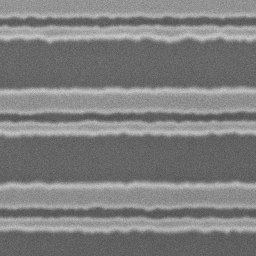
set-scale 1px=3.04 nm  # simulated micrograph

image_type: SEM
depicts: lines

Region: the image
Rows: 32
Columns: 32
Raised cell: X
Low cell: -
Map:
XXXXXXXXXXXXXXXXXXXXXXXXXXXXXXXX
XXXXXXXXXXXXXXXXXXXXXXXXXXXXXXXX
XXXXXXXXXXXXXXXXXXXXXXXXXXXXXXXX
XXXXXXXXXXXXXXXXXXXXXXXXXXXXXXXX
XXXXXXXXXXXXXXXXXXXXXXXXXXX-XXXX
--------------------------------
--------------------------------
--------------------------------
--------------------------------
--------------------------------
--------------------------------
XXXXXXXXXXXXXXXXXXXXXXXXXXXXXXXX
XXXXXXXXXXXXXXXXXXXXXXXXXXXXXXXX
XXXXXXXXXXXXXXXXXXXXXXXXXXXXXXXX
XXXXXXXXXXXXXXXXXXXXXXXXXXXXXXXX
XXXXXXXXXXXXXXXXXXXXXXXXXXXXXXXX
XXXXXXXXXXXXXXX-XXXXXXXXXX-X--XX
--------------------------------
--------------------------------
--------------------------------
--------------------------------
--------------------------------
--------------------------------
XXXXXXXXXXXXXXXXXXXXXXXXXXXXXXXX
XXXXXXXXXXXXXXXXXXXXXXXXXXXXXXXX
XXXXXXXXXXXXXXXXXXXXXXXXXXXXXXXX
XXXXXXXXXXXXXXXXXXXXXXXXXXXXXXXX
XXXXXXXXXXXXXXXXXXXXXXXXXXXXXXXX
XXXXXXXXXXXXXXXXXXXXXXXXXXXXXXXX
--------------------------------
--------------------------------
--------------------------------